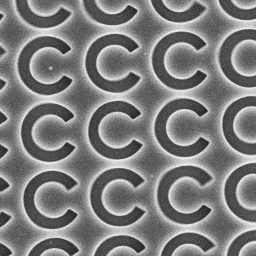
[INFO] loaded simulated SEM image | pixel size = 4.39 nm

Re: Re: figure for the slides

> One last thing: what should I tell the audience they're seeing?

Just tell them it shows an array of small figures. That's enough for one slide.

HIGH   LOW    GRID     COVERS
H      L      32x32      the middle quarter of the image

HHHHHLLLHHHHHHHHHHHHHHLLLHHHHHHH
HHHHHLLLLHHHHHHHHHHHHHLLLLHHHHHH
HHHHHHLLLHHHHHHHLLHHHHHLLLLHHHHH
LLHHHHLLLLHHHHLLLLLHHHHLLLLLHLLL
LLHHHHHLLLLLLLLLLLLHHHHHLLLLLLLL
LHHHHHHHLLLLLLLLLLHHHHHHHLLLLLLL
HHHHHHHHHHLLLLLLLHHHHHHHHHHHLLLH
HHHHHHHHHHHHHLHHHHHHHHHHHHHHHHHH
HHHHHHHHHHHHHHHHHHHHHHHHHHHHLLLH
HHHHHHHHHHHLLLLLHHHHHHHHHHLLLLLL
HHHHHHHHHLLLLLLLLLHHHHHHHLLLLLLL
LHHHHHHHLLLLLLLLLLLHHHHHLLLLLLLL
LLHHHHHLLLLHHHHLLLLHHHHLLLLHHHHH
LLHHHHHLLLHHHHHHHLHHHHHLLLHHHHHH
LHHHHHLLLHHHHHHHHHHHHHHLLLHHHHHH
HHHHHHLLLHHHHHHHHHHHHHLLLLHHHHHH
HHHHHHLLLHHHHHHHHHHHHHLLLLHHHHHH
HHHHHHLLLHHHHHHHHHHHHHLLLLHHHHHH
HHHHHHLLLHHHHHHHHHHHHHHLLLHHHHHH
HHHHHHLLLLHHHHHHHLLHHHHLLLLLHHHH
LLLHHHHLLLLLHHHLLLLLHHHHLLLLLLLL
LLLHHHHHLLLLLLLLLLLHHHHHHLLLLLLL
LLHHHHHHLLLLLLLLLLHHHHHHHHLLLLLL
HHHHHHHHHHLLLLLLHHHHHHHHHHHHHLHH
HHHHHHHHHHHHHHHHHHHHHHHHHHHHHHHH
HHHHHHHHHHHHHHHHHHHHHHHHHHHHHLLL
HHHHHHHHHHLLLLLLLHHHHHHHHHLLLLLL
LHHHHHHHHLLLLLLLLLLHHHHHHLLLLLLL
LLHHHHHHLLLLLLLLLLLLHHHHLLLLLLLH
LLLHHHHLLLLLHHHHLLLLHHHHLLLLHHHH
LLLHHHHLLLLHHHHHHLLHHHHLLLLHHHHH
HLHHHHLLLLHHHHHHHHHHHHHLLLLHHHHH